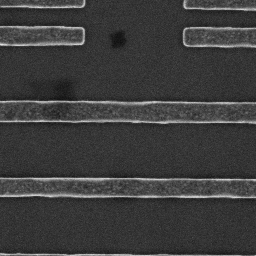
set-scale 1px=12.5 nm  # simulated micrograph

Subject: wiring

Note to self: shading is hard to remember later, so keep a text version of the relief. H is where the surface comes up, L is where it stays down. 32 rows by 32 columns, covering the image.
HHHHHHHHHHHLLLLLLLLLLLLHHHHHHHHH
LLLLLLLLLLLLLLLLLLLLLLLLLLLLLLLL
LLLLLLLLLLLLLLLLLLLLLLLLLLLLLLLL
HHHLHHHHHHLLLLLLLLLLLLLHHHLLLLLL
HHHHHHHHHHLLLLLLLLLLLLLHHHHHHHHH
HHHHHLLLLHLLLLLLLLLLLLLHHHHHHHHH
LLLLLLLLLLLLLLLLLLLLLLLLLLLLLLLL
LLLLLLLLLLLLLLLLLLLLLLLLLLLLLLLL
LLLLLLLLLLLLLLLLLLLLLLLLLLLLLLLL
LLLLLLLLLLLLLLLLLLLLLLLLLLLLLLLL
LLLLLLLLLLLLLLLLLLLLLLLLLLLLLLLL
LLLLLLLLLLLLLLLLLLLLLLLLLLLLLLLL
LLLLLLLLLLLLLLLLLLLLLLLLLLLLLLLL
HHHHHHHHHHHHHHHHHHHHHHHHHHHHHHHH
HHHHHHHHHHHHHHHHHHHHHHHHHHHHHHHH
LLLLLLLLLLLLLLLLLLLLLLLLLLLLLLLL
LLLLLLLLLLLLLLLLLLLLLLLLLLLLLLLL
LLLLLLLLLLLLLLLLLLLLLLLLLLLLLLLL
LLLLLLLLLLLLLLLLLLLLLLLLLLLLLLLL
LLLLLLLLLLLLLLLLLLLLLLLLLLLLLLLL
LLLLLLLLLLLLLLLLLLLLLLLLLLLLLLLL
LLLLLLLLLLLLLLLLLLLLLLLLLLLLLLLL
HHHHHHHHHHHHHHHHHHHHHHHHHHHHHHHL
HHHHHHHHHHHHHHHHHHHHHHHHHHHHHHHH
LLLLLLLLLLHHHHHHHHHHHHHHHHHHLHHH
LLLLLLLLLLLLLLLLLLLLLLLLLLLLLLLL
LLLLLLLLLLLLLLLLLLLLLLLLLLLLLLLL
LLLLLLLLLLLLLLLLLLLLLLLLLLLLLLLL
LLLLLLLLLLLLLLLLLLLLLLLLLLLLLLLL
LLLLLLLLLLLLLLLLLLLLLLLLLLLLLLLL
LLLLLLLLLLLLLLLLLLLLLLLLLLLLLLLL
LLLLLLLLLLLLLLLLLLLLLLLLLLLLLLLL